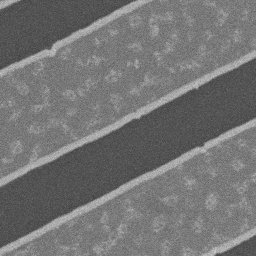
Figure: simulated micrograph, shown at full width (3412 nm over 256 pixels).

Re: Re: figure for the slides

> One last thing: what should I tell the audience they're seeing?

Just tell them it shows one or a few lines or trenches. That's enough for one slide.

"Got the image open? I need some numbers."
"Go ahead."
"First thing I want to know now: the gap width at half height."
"797 nanometers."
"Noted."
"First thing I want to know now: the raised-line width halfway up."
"1310 nm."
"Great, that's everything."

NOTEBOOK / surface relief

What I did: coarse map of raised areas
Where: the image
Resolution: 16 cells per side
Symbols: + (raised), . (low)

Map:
........++++++++
......++++++++++
....++++++++++++
..++++++++++++++
++++++++++++++..
++++++++++++....
++++++++++......
++++++++........
++++++........++
++++........++++
++........++++++
........++++++++
......++++++++++
....++++++++++++
..++++++++++++++
.+++++++++++++..